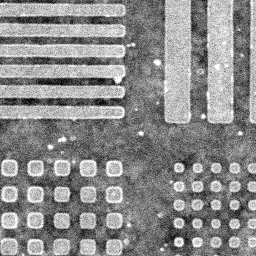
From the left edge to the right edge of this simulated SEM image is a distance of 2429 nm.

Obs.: groups of lines, slits or small figures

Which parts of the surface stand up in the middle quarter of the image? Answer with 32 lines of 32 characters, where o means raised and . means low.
.........................oooooo.
ooooooooooooooo..........oooooo.
ooooooooooooooo..........oooooo.
.............o...........oooooo.
.............o...........oooooo.
.........................oooooo.
ooooooooooooooo..........oooooo.
ooooooooooooooo..........oooooo.
.........................oooooo.
.........................oooooo.
.........................oooooo.
ooooooooooooooo..........oooooo.
ooooooooooooooo..........oooooo.
..o......................oooooo.
................................
................................
................................
...................o............
................................
................................
................................
................................
................................
................................
.....oo.........................
o...oooo...ooo..............oo..
o...oooo...ooo..............oo..
o...oooo...ooo..................
................................
................................
............................oo..
o...oooo...ooo..................